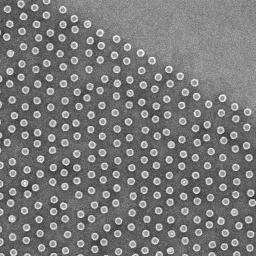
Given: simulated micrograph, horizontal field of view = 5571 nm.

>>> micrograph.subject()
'a regular array of raised bodies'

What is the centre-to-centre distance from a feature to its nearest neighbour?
279 nm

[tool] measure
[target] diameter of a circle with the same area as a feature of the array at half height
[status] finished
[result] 149 nanometres